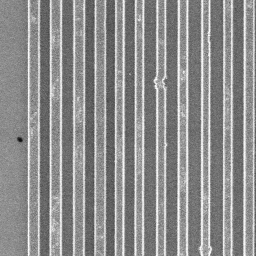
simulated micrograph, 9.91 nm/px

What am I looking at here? parallel lines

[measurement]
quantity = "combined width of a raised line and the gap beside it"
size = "0.214 µm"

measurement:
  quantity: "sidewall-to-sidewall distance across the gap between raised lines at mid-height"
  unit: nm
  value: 124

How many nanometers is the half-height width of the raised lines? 89.2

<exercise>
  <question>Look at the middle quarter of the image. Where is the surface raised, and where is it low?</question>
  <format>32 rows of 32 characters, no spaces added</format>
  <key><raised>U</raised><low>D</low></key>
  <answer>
DDDUUDDDUUDDDUUDDDUUDDDUUDDDDUUD
DDDUUDDDUUDDDUUDDDUUDDDUUDDDDUUD
DDDUUDDDUUDDDUUDDDUUDDDUUDDDDUUD
DDDUUDDDUUDDDUUDDDUUDDDUUDDDDUUD
DDDUUDDDUUDDDUUDDDUUDDDUUDDDDUUD
DDDUUDDDUUDDDUUDDDUUDDDUUDDDDUUD
DDDUUDDDUUDDDUUDDDUUDDDUUDDDDUUD
DDDUUDDDUUDDDUUDDDUUDDDUUDDDDUUD
DDDUUDDDUUDDDUUDDDUUDDDUUDDDDUUD
DDDUUDDDUUDDDUUDDDUUDDDUUDDDDUUD
DDDUUDDDUUDDDUUDDDUUDDDUUDDDDUUD
DDDUUDDDUUDDDUUDDDUUDDDUUDDDDUUD
DDDUUDDDUUDDDUUDDDUUDDDUUDDDDUUD
DDDUUDDDUUDDDUUDDDUUDDDUUDDDDUUD
DDDUUDDDUUDDDUUDDDUUDDDUUDDDDUUD
DDDUUDDDUUDDDUUDDDUUDDDUUDDDDUUD
DDDUUDDDUUDDDUUDDDUUDDDUUDDDDUUD
DDDUUDDDUUDDDUUDDDUUDDDUUDDDDUUD
DDDUUDDDUUDDDUUDDDUUDDDUUDDDDUUD
DDDUUDDDUUDDDUUDDDUUDDDUUDDDDUUD
DDDUUDDDUUDDDUUDDDUUDDDUUDDDDUUD
DDDUUDDDUUDDDUUDDDUUDDDUUDDDDUUD
DDDUUDDDUUDDDUUDDDUUDDDUUDDDDUUD
DDDUUDDDUUDDDUUDDDUUDDDUUDDDDUUD
DDDUUDDDUUDDDUUDDDUUDDDUUDDDDUUD
DDDUUDDDUUDDDUUDDDUUDDDUUDDDDUUD
DDDUUDDDUUDDDUUDDDUUDDDUUDDDDUUD
DDDUUDDDUUDDDUUDDDUUDDDUUDDDDUUD
DDDUUDDDUUDDDUUDDDUUDDDUUDDDDUUD
DDDUUDDDUUDDDUUDDDUUDDDUUDDDDUUD
DDDUUDDDUUDDDUUDDDUUDDDUUDDDDUUD
DDDUUDDDUUDDDUUDDDUUDDDUUDDDDUUD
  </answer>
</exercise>